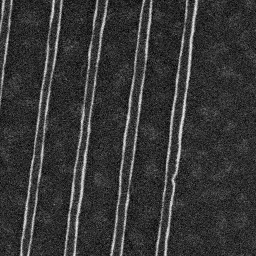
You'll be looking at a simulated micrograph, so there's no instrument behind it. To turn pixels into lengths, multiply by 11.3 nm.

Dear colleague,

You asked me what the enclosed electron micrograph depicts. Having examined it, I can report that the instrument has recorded parallel lines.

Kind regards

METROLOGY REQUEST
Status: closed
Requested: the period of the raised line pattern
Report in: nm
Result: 506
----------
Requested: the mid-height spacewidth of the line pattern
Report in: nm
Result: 399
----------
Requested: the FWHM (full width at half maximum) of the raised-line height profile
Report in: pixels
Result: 8.68